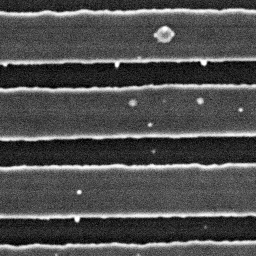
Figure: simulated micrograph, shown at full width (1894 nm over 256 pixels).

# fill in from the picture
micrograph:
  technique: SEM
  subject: lines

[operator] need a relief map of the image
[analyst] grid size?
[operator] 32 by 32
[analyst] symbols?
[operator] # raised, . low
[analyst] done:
................................
.....##..#######################
################################
################################
################################
################################
################################
################################
................................
................................
................................
################################
################################
################################
################################
################################
################################
##.##...........................
................................
................................
................................
################################
################################
################################
################################
################################
################################
................................
................................
................................
..............#....#############
################################